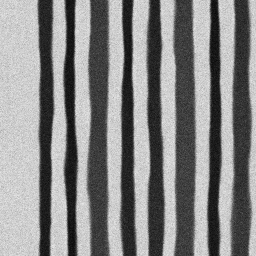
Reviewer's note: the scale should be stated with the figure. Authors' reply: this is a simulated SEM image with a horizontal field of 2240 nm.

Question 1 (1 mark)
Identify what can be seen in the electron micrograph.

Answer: parallel lines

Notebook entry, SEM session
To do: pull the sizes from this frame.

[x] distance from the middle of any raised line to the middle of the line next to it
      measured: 244 nanometres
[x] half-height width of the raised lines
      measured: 134 nanometres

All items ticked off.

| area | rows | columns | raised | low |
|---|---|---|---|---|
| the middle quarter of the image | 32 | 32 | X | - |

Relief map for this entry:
--XXXX-----XXXX--XXXX---XXXX----
---XXX-----XXXX--XXXX---XXXX----
---XXX-----XXXX--XXXX---XXXX----
---XXX-----XXXX--XXXX---XXXX----
---XXX-----XXXX--XXXX---XXXX----
---XXX-----XXXX--XXXX---XXXX----
---XXX-----XXXX--XXXX---XXXX----
---XXX-----XXXX--XXXX---XXXX----
---XXX-----XXXX--XXXX---XXXX----
---XXXX----XXXX--XXXX---XXXX----
---XXXX----XXXX--XXXX---XXXX----
X--XXXX----XXXX--XXXX---XXXX----
X--XXXX----XXXX--XXXX---XXXX----
X--XXXX----XXX---XXXX---XXXX----
X--XXXX----XXX---XXXX---XXXX----
X--XXXX----XXX---XXXX---XXXX----
X--XXXX----XXX---XXXX---XXXX----
X--XXX-----XXX----XXX---XXXX----
X--XXX-----XXX----XXX---XXXX----
X--XXX-----XXX---XXXX---XXXX----
X--XXX-----XXX---XXXX---XXXX----
X--XXX-----XXX---XXXX----XXX----
X--XXX-----XXX---XXXX----XXX----
X--XXX-----XXX---XXXX----XXX----
X--XXX-----XXX---XXXX----XXX----
---XXX-----XXX---XXXXX---XXX----
---XXX-----XXX---XXXX----XXX----
---XXX-----XXX---XXXX----XXX----
---XXX-----XXX---XXXX----XXX----
---XXX-----XXX---XXXX----XXX----
---XXX-----XXX---XXXX----XXX----
X--XXX-----XXX----XXX----XXX----